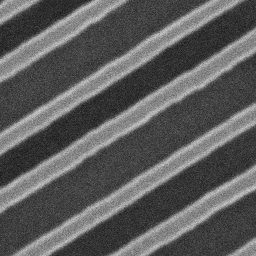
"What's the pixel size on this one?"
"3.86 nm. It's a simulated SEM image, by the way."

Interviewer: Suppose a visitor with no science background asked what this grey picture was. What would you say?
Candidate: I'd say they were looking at lines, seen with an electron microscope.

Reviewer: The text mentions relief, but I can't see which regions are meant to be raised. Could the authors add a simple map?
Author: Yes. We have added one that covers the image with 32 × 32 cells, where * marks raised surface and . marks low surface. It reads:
****.......****...........***...
**.......****...........****....
*.......****...........***......
......****...........****.......
.....****..........****........*
...*****..........***........***
..****..........****........****
****...........****.......****..
***..........****........****...
*...........***........****.....
..........****.......*****......
........****.......*****........
.......****.......****..........
.....****.......*****..........*
....***........****..........***
..****.......*****..........****
****.......*****..........****..
***.......****...........***....
*........****..........****.....
.......****...........****......
.....*****..........****........
....****..........****.........*
..****...........****........***
*****..........****........*****
***...........****........****..
**..........****........*****...
..........****.........****.....
.........****........****.......
.......****........*****........
......****........****..........
....****........****...........*
..*****........****...........**